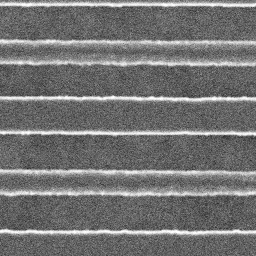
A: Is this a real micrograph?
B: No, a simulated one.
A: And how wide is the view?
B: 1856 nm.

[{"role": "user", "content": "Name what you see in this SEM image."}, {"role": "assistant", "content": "lines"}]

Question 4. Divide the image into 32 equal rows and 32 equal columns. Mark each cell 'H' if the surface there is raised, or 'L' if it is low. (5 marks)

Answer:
HHHHHHHHHHHHHHHHHHHHHHHHHHHHHHHH
LLLLLLLLLLLLLLLLLLLLLLLLLLLLLLLL
LLLLLLLLLLLLLLLLLLLLLLLLLLLLLLLL
LLLLLLLLLLLLLLLLLLLLLLLLLLLLLLLL
LLLLLLLLLLLLLLLLLLLLLLLLLLLLLLLL
HHHHHHHHHHHHHHHHHHHHHHHHHHHHHHHH
HHHHHHHHHHHHHHHHHHHHHHHHHHHHHHHH
HHHHHHHHHHHHHHHHHHHHHHHHHHHHHHHH
LLLLLLLLLLLLLLLLLLLLLLLLLLLLLLLL
LLLLLLLLLLLLLLLLLLLLLLLLLLLLLLLL
LLLLLLLLLLLLLLLLLLLLLLLLLLLLLLLL
LLLLLLLLLLLLLLLLLLLLLLLLLLLLLLLL
HHHHHHHHHHHHHHHHHHHHHHHHHHHHHHHH
HHHHHHHHHHHHHHHHHHHHHHHHHHHHHHHH
HHHHHHHHHHHHHHHHHHHHHHHHHHHHHHHH
HHHHHHHHHHHHHHHHHHHHHHHHHHHHHHHH
HHHHHHHHHHHHHHHHHHHHHHHHHHHHHHHH
LLLLLLLLLLLLLLLLLLLLLLLLLLLLLLLL
LLLLLLLLLLLLLLLLLLLLLLLLLLLLLLLL
LLLLLLLLLLLLLLLLLLLLLLLLLLLLLLLL
LLLLLLLLLLLLLLLLLLLLLLLLLLLLLLLL
HHHHHHLHHHLLLLLLLLLLLLLLLLLLLLLL
HHHHHHHHHHHHHHHHHHHHHHHHHHHHHHHH
HHHHHHHHHHHHHHHHHHHHHHHHHHHHHHHH
LLLLLLLLLLLLLLLLLLLLLLLLLLLLLLLL
LLLLLLLLLLLLLLLLLLLLLLLLLLLLLLLL
LLLLLLLLLLLLLLLLLLLLLLLLLLLLLLLL
LLLLLLLLLLLLLLLLLLLLLLLLLLLLLLLL
LLLLLLLLLLLLLLLLLLLLLLLLLLLLLLLL
HHHHHHHHHHHHHHHHHHHHHHHHHHHHHHHH
HHHHHHHHHHHHHHHHHHHHHHHHHHHHHHHH
HHHHHHHHHHHHHHHHHHHHHHHHHHHHHHHH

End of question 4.